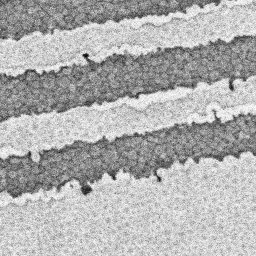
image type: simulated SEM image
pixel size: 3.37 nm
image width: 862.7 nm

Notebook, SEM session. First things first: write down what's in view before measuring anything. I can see one or a few lines or trenches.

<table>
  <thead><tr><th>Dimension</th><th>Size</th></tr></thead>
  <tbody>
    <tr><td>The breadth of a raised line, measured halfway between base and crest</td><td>0.11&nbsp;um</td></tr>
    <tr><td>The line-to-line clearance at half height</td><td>147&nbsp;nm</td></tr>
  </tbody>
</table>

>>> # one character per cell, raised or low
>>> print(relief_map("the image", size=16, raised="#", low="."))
.............###
.......#########
.############...
#######.........
#...............
............####
.......#########
.############...
#######.........
##..............
..........######
......##########
################
################
################
################